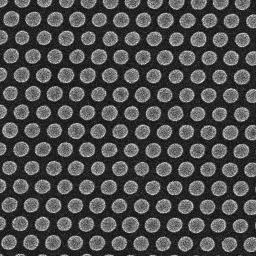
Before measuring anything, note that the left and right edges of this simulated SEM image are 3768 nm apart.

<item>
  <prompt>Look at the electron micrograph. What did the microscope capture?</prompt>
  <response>a regular array of raised bodies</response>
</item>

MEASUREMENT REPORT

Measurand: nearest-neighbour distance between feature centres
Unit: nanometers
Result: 313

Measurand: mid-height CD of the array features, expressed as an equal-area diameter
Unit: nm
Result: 216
